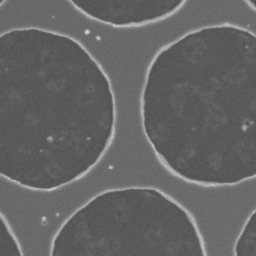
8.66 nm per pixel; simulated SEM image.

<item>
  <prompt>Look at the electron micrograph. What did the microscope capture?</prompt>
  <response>holes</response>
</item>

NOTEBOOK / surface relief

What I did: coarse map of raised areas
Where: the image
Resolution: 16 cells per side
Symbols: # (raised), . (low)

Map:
#####......#####
#######.########
....#######.....
......####......
......###.......
.......##.......
.......##.......
.......##.......
.......##.......
......####......
......#####.....
#...############
######.....#####
#####.......####
.###........###.
.##..........##.